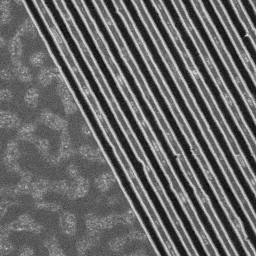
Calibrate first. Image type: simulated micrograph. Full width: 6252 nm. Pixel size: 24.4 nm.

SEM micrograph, parallel lines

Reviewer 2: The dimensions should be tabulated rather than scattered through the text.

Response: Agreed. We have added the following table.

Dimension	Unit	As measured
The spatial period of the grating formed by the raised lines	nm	423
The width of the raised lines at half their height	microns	0.207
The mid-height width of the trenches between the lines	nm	210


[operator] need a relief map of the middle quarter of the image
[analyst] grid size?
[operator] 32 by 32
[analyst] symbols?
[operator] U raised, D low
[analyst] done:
DUUDDDUUDDDUUDDDUUDDDUUDDDUUDDDU
DDUUDDDUUDDDUUDDDUUDDDUUDDUUDDDU
DDUUDDDUUUDDUUDDDUUDDDUUDDDUUDDD
DDDUUDDDUUDDDUUDDDUUDDDUUDDUUUDD
UDDUUUDDUUDDDUUDDDUUDDDUUDDDUUDD
UDDDUUDDDUUDDDUUDDDUUDDDUUDDUUUD
UUDDUUUDDUUDDDUUUDDUUDDDUUDDDUUD
UUDDDUUDDDUUDDDUUDDDUUDDDUUDDDUU
UUUDDUUUDDUUUDDUUUDDUUDDDUUDDDUU
UUUDDDUUDDDUUDDDUUDDDUUDDDUUDDDU
UUUUDDUUUDDDUUDDUUUDDUUUDDUUDDDU
UUUUDDDUUDDDUUDDDUUDDDUUDDDUUDDD
UUUUUDDDUUDDDUUDDUUUDDDUUDDUUDDD
UUUUUDDDUUDDDUUDDDUUDDDUUDDDUUDD
UUUUUUDDDUUDDDUUDDUUUDDUUUDDUUDD
UUUUUUUDDUUDDDUUDDDUUDDDUUDDDUUD
UUUUUUUDDDUUDDDUUDDDUUDDDUUDDUUU
UUUUUUUUDDUUDDDUUDDDUUDDDUUDDDUU
UUUUUUUUDDDUUDDDUUDDDUUDDUUUDDDU
UUUUUUUUUDDUUUDDUUUDDUUDDDUUDDDU
UUUUUUUUUDDDUUDDDUUDDDUUDDDUUDDD
UUUUUUUUUUDDUUUDDUUUDDUUUDDUUDDD
UUUUUUUUUUDDDUUDDDUUDDDUUDDDUUDD
UUUUUUUUUUUDDUUUDDUUUDDUUUDDUUDD
UUUUUUUUUUUDDDUUDDDUUDDDUUDDDUUD
UUUUUUUUUUUUDDDUUDDDUUDDUUUDDUUD
UUUUUUUUUUUUDDDUUDDDUUDDDUUDDDUU
UUUUUUUUUUUUUDDDUUDDDUUDDUUUDDUU
UUUUUUUUUUUUUDDDUUDDDUUDDDUUDDDU
UUUUUUUUUUUUUUDDDUUDDDUUDDUUUDDU
UUUUUUUUUUUUUUDDDUUDDDUUDDDUUDDD
UUUUUUUUUUUUUUUDDDUUDDDUUDDUUUDD